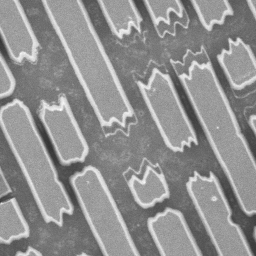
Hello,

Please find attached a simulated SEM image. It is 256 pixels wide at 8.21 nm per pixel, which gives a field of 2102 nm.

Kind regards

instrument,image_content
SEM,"parallel lines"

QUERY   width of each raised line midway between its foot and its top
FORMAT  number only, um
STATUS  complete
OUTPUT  0.244